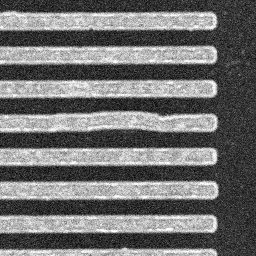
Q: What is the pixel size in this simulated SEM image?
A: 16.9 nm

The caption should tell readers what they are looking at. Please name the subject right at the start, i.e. parallel lines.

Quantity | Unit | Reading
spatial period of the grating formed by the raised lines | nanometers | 573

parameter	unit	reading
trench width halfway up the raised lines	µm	0.328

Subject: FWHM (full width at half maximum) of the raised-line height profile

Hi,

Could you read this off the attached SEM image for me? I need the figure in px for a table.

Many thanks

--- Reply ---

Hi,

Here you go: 14.5